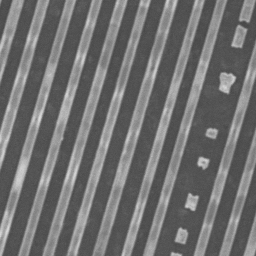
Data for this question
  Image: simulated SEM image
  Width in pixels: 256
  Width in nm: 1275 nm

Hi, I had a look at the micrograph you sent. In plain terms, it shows parallel lines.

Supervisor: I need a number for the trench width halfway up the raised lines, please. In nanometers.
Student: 78.3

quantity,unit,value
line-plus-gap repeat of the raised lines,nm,121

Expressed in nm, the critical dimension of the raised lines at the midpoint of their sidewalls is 46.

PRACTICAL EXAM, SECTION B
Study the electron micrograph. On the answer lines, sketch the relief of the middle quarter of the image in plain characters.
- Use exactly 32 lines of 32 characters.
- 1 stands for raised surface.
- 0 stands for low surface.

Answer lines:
00111000111000011000010000001100
00110000111000110000010000001100
00110000110000110000111000001100
00110000110000110000111000011000
01100001110001110000110000011000
01100001100001100001110000011000
01100001100001100001110000111000
11100011100001100001100000110001
11100011100011000001100000110001
11000011000011000011100000110001
11000011000011000011100001100001
10000111000111000011000001100011
10000110000110000111000001100011
10000110000110000111000011100011
10001110000110000110000011000111
00001110001100000110000011000111
00001100001100001110000111000110
00001100001100001110000110000110
00011100011000001100000110001110
00011000011000011100000110001100
00011000011000011100001100001100
00111000111000011000001100011100
00111000110000111000001100011000
00110000110000111000011100011000
00110000110000111000011000011000
01110001100000110000011000111000
01100001100001110000011000110000
01100001100001110000110000110000
11100011100001100000110001110000
11100011000011100000110001100000
11000011000011100001110001100000
11000011000011100001100011100000